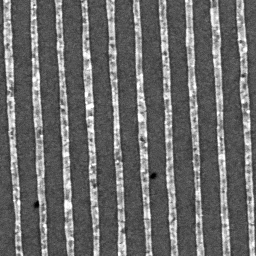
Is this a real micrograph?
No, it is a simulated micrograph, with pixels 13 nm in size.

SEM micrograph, parallel lines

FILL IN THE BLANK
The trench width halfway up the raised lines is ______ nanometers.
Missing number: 267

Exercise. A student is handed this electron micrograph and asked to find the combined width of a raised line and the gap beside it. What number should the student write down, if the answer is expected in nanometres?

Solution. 337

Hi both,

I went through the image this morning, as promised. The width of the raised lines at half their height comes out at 69.7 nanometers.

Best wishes